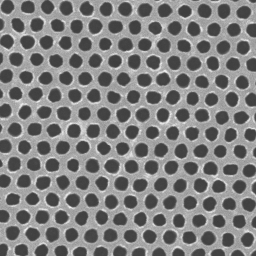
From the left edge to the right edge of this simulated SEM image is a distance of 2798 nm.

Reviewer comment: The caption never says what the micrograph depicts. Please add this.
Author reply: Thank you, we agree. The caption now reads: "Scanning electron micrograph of a regular array of holes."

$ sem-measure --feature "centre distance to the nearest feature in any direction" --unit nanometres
209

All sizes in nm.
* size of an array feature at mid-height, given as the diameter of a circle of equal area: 147